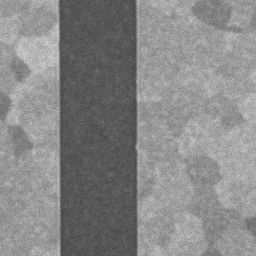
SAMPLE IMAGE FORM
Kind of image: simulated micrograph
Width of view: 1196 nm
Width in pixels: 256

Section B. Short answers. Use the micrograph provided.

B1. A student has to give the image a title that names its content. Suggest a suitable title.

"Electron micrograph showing one or a few lines or trenches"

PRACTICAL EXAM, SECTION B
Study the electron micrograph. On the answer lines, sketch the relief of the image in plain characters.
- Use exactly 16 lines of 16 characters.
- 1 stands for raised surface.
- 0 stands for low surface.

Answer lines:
1111000001111111
1111000001111111
1111000001111111
1111000001111111
1111000001111111
1111000001111111
1111000001111111
1111000001111111
1111000001111111
1111000001111111
1111000001111111
1111000001111111
1111000001111111
1111000001111111
1111000001111111
1111000001111111